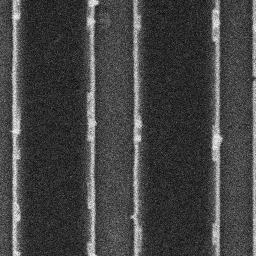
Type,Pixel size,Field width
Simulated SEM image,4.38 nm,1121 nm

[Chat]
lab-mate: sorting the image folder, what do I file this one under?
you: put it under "one or a few lines or trenches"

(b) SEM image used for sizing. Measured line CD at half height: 362 nanometers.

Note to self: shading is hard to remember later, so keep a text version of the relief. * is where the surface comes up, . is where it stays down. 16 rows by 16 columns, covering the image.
.*****..******..
.*****..******..
.*****..******..
.*****..******..
.*****..******..
.*****...*****..
.*****..******..
.*****..******..
.*****..******..
.*****...*****..
.*****..******..
.*****..******..
.*****..******..
.*****..******..
.*****..******..
.*****..******..